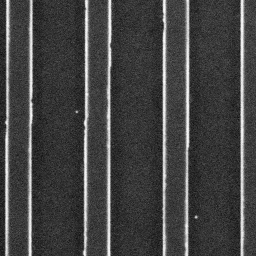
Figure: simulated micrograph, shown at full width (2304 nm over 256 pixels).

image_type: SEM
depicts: lines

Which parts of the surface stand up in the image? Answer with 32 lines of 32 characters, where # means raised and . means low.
.###.......###......####......##
.###.......###......####......##
.###.......###.......###......##
.###.......###.......###......##
.###.......###.......###......##
.###.......###......####......##
.###.......###......####......##
.###.......###......####......##
.###.......###......####......##
.###.......###......####......##
.###.......###......####......##
.###.......###......####......##
.###.......###......####......##
.###.......###......####......##
.###.......###......####......##
.###.......###......####......##
.###.......###......###.......##
.###.......###......###.......##
.###.......###......###.......##
.###.......###......###.......##
.###.......###......###.......##
.###.......###......###.......##
.###.......###......###.......##
.###.......###......###.......##
.###.......###......###.......##
.###.......###......###.......##
.###.......###......###.......##
.###.......###......###.......##
.###.......###......###.......##
.###.......###......###.......##
.###.......###......###.......##
.###.......###......###.......##